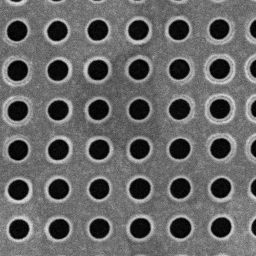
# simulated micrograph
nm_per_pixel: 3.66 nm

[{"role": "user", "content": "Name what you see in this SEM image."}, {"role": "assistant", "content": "a regular array of holes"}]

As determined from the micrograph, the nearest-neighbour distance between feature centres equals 39.5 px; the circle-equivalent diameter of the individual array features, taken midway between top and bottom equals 78.2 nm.